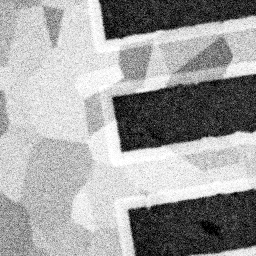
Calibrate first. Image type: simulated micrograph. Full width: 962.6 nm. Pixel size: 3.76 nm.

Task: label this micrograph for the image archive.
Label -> one or a few lines or trenches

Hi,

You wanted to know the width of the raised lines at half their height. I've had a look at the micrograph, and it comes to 160 nm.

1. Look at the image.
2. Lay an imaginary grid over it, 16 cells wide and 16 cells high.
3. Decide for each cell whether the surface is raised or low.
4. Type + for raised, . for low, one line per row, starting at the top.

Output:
++++++..........
++++++.........+
++++++...+++++++
++++++++++++++++
++++++++++++++..
++++++++........
+++++++.........
+++++++.........
+++++++.........
+++++++....+++++
++++++++++++++++
+++++++++++++++.
+++++++++.......
++++++++........
++++++++........
++++++++........